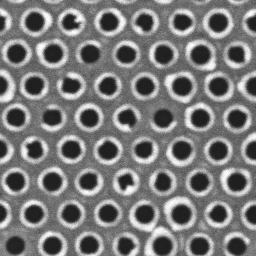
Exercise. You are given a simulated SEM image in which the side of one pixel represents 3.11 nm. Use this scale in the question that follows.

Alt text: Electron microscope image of a regular array of holes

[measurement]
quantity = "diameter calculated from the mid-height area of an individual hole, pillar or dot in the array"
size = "57.7 nm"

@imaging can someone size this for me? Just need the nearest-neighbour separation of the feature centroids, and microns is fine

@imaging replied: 0.113